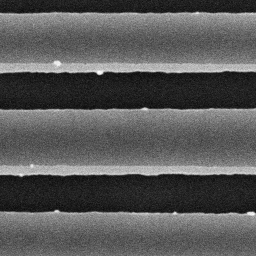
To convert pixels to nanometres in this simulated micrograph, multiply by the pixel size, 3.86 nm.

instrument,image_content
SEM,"lines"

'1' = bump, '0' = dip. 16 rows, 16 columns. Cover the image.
0000000000000000
1111111111111111
1111111111111111
1111111111111111
1001001000010000
0000000000000000
0000000000000000
1111111111111111
1111111111111111
1111111111111111
1111111111111111
0000000000000000
0000000000000000
1111111111111111
1111111111111111
1111111111111111